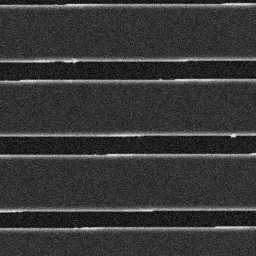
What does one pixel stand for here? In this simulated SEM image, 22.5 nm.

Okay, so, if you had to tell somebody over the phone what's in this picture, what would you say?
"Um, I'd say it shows lines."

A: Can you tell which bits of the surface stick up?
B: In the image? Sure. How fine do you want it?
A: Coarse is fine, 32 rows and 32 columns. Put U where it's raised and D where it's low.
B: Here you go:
DDDDDDDDDDDDDDDDDDDDDDDDDDDDUUUU
UUUUUUUUUUUUUUUUUUUUUUUUUUUUUUUU
UUUUUUUUUUUUUUUUUUUUUUUUUUUUUUUU
UUUUUUUUUUUUUUUUUUUUUUUUUUUUUUUU
UUUUUUUUUUUUUUUUUUUUUUUUUUUUUUUU
UUUUUUUUUUUUUUUUUUUUUUUUUUUUUUUU
UUUUUUUUUUUUUUUUUUUUUUUUUUUUUUUU
UUUUUUUUUUUUUUUUUUUUUUUUDDDDDDDD
DDDDDDDDDDDDDDDDDDDDDDDDDDDDDDDD
DDDDDDDDDDDDDDDDDDDDDDDDDDDDDDDD
UUUUUUUUUUUUUUUUUUUUUUUUUUUUUUUU
UUUUUUUUUUUUUUUUUUUUUUUUUUUUUUUU
UUUUUUUUUUUUUUUUUUUUUUUUUUUUUUUU
UUUUUUUUUUUUUUUUUUUUUUUUUUUUUUUU
UUUUUUUUUUUUUUUUUUUUUUUUUUUUUUUU
UUUUUUUUUUUUUUUUUUUUUUUUUUUUUUUU
UUUUUUUUUUUUUUUUUUUUUUUUUUUUUUUU
DDDDDDDDDDDDDDDDDDDDDDDDDDDDDDDD
DDDDDDDDDDDDDDDDDDDDDDDDDDDDDDDD
UUUUUUUUUUUUUUUUUUUUUUUUUUUUUUUU
UUUUUUUUUUUUUUUUUUUUUUUUUUUUUUUU
UUUUUUUUUUUUUUUUUUUUUUUUUUUUUUUU
UUUUUUUUUUUUUUUUUUUUUUUUUUUUUUUU
UUUUUUUUUUUUUUUUUUUUUUUUUUUUUUUU
UUUUUUUUUUUUUUUUUUUUUUUUUUUUUUUU
UUUUUUUUUUUUUUUUUUUUUUUUUUUUUUUU
DDDDDDDDDDDDDDDDDDDDDDDDDDDDDDDD
DDDDDDDDDDDDDDDDDDDDDDDDDDDDDDDD
DDDDDDDDDDDDDDDDDDDDDDDDDDDUUUUU
UUUUUUUUUUUUUUUUUUUUUUUUUUUUUUUU
UUUUUUUUUUUUUUUUUUUUUUUUUUUUUUUU
UUUUUUUUUUUUUUUUUUUUUUUUUUUUUUUU